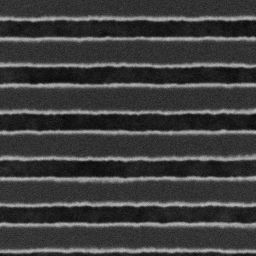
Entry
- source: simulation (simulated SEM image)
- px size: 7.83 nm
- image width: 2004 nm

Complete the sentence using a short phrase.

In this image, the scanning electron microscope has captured lines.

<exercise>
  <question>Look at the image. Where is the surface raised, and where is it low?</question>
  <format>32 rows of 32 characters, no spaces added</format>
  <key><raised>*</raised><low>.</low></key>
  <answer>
********************************
********************************
...***.................**.......
................................
................................
********************************
********************************
********************************
................................
................................
................................
********************************
********************************
********************************
................................
................................
..**....*..............**..**..*
********************************
********************************
********************************
................................
................................
********************************
********************************
********************************
********************************
................................
................................
********************************
********************************
********************************
**..........*...............***.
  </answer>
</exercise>